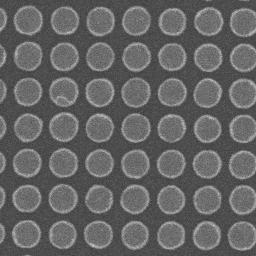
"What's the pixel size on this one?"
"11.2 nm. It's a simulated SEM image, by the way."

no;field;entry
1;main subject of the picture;a regular array of raised bodies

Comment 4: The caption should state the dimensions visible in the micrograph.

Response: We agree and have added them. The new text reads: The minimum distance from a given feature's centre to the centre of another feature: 398 nm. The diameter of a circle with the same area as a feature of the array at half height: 310 nm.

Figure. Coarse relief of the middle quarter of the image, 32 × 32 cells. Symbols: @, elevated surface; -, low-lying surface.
@@@---@@@@@@----@@@@-----@@@@@--
--------@@-------@@-------------
--------------------------------
--------------------------------
@@-----@@@@-----@@@@-----@@@@---
@@@---@@@@@@---@@@@@@---@@@@@@--
@@@---@@@@@@---@@@@@@---@@@@@@@-
@@@---@@@@@@---@@@@@@--@@@@@@@@-
@@@---@@@@@@---@@@@@@---@@@@@@--
-@-----@@@@@---@@@@@@---@@@@@---
--------@@------@@@-------------
--------------------------------
@-------------------------------
@@@----@@@@----@@@@@-----@@@@---
@@@---@@@@@@---@@@@@@---@@@@@@--
@@@---@@@@@@---@@@@@@---@@@@@@--
@@@---@@@@@@---@@@@@@@--@@@@@@--
@@@---@@@@@@---@@@@@@---@@@@@@--
@@-----@@@@-----@@@@@---@@@@@---
--------------------------@@----
--------------------------------
@-------@@----------------------
@@----@@@@@-----@@@@-----@@@@---
@@@---@@@@@@---@@@@@@---@@@@@@--
@@@---@@@@@@---@@@@@@---@@@@@@--
@@@---@@@@@@---@@@@@@---@@@@@@--
@@@---@@@@@@---@@@@@@---@@@@@@--
@@-----@@@@----@@@@@-----@@@@---
--------------------------------
--------------------------------
@----------------@@-------------
@@-----@@@@----@@@@@----@@@@@---